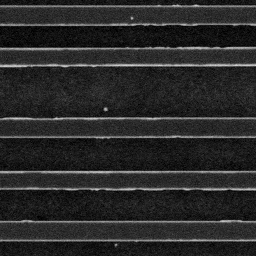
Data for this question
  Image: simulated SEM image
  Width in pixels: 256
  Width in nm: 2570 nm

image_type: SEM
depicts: lines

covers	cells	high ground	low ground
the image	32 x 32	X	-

--------------------------------
XXXXXXXXXXXXXXXXXXXXXXXXXXXXXXXX
XXXXXXXXXXXXXXXXXXXXXXXXXXXXXXXX
--------------------------------
--------------------------------
--------------------------------
XXXXXXXXXXXXXXXXXXXXXXXXXXXXXXXX
XXXXXXXXXXXXXXXXXXXXXXXXXXXXXXXX
--------------------------------
--------------------------------
--------------------------------
--------------------------------
--------------------------------
--------------------------------
--------------------------------
XXXXXXXXXXXXXXXXXXXXXXXXXXXXXXXX
XXXXXXXXXXXXXXXXXXXXXXXXXXXXXXXX
--------------------------------
--------------------------------
--------------------------------
--------------------------------
XXXXXXXXXXXXXXXXXXXXXXXXXXXXXXXX
XXXXXXXXXXXXXXXXXXXXXXXXXXXXXXXX
XXXXXXXXXXXXXXXXXXXXXXXXXXXXXXXX
--------------------------------
--------------------------------
--------------------------------
--------------------------------
XXXXXXXXXXXXXXXXXXXXXXXXXXXXXXXX
XXXXXXXXXXXXXXXXXXXXXXXXXXXXXXXX
--------------------------------
--------------------------------